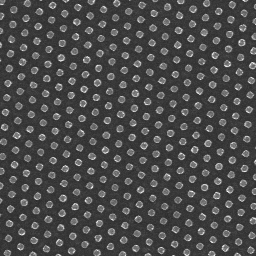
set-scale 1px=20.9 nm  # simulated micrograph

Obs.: a regular array of raised bodies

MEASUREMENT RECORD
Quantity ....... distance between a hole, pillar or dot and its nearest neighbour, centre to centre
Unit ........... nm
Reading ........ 303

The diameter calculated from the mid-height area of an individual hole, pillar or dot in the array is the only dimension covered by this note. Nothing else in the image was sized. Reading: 6.96 pixels